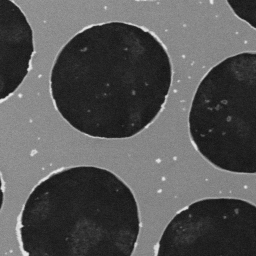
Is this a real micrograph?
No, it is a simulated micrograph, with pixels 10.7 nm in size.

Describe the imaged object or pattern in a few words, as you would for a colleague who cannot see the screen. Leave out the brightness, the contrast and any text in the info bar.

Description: holes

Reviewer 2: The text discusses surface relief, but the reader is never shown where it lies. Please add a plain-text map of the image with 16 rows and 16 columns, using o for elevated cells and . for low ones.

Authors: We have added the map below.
.ooooooooooooo..
..ooooo.oooooooo
..oo......oooooo
..oo......ooooo.
..o........oo...
.oo........o....
ooo.......oo....
oooo......oo....
oooooo..oooo....
oooooooooooo....
ooooo.oooooooo..
ooo.....oooooooo
oo......ooooo..o
o........oo.....
o........o......
oo......oo......